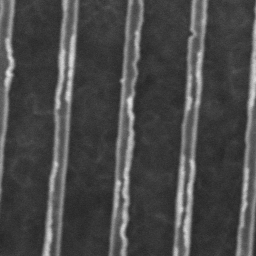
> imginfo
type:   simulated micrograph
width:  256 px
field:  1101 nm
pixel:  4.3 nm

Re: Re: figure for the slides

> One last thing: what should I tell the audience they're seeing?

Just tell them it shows one or a few lines or trenches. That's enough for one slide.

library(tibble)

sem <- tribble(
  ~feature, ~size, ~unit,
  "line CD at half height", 57.8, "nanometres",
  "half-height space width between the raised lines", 220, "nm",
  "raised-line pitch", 0.275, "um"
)